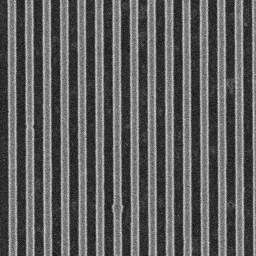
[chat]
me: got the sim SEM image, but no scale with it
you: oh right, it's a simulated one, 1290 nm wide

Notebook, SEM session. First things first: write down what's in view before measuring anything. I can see parallel lines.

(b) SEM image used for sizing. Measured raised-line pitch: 88 nm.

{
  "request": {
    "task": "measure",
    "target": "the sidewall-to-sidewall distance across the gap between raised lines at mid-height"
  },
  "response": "54.8 nanometres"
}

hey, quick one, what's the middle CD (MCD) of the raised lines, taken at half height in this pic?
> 34 nm